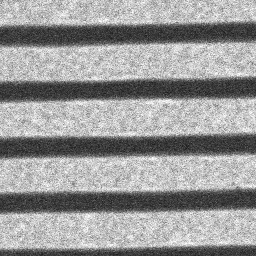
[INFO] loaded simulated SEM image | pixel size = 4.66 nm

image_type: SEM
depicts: parallel lines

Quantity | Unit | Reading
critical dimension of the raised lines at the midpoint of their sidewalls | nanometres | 171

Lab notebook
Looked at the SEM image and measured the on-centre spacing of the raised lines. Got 0.26 micrometres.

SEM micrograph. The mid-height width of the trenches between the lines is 19.2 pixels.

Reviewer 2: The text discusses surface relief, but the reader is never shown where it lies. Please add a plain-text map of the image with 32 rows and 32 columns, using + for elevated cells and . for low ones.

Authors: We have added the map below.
++++++++++++++++++++++++++++++++
++++++++++++++++++++++++++++++++
++++++++++++++++++++++++++++++++
................................
................................
................++++++++++++++++
++++++++++++++++++++++++++++++++
++++++++++++++++++++++++++++++++
++++++++++++++++++++++++++++++++
++++++++++++++++++++++++++++++++
................................
................................
.........+++++++++++++++++++++++
++++++++++++++++++++++++++++++++
++++++++++++++++++++++++++++++++
++++++++++++++++++++++++++++++++
++++++++++++++++++++++++++++++++
................................
................................
...............+++++++++++++++++
++++++++++++++++++++++++++++++++
++++++++++++++++++++++++++++++++
++++++++++++++++++++++++++++++++
++++++++++++++++++++++++++++++++
................................
................................
.....................+++++++++++
++++++++++++++++++++++++++++++++
++++++++++++++++++++++++++++++++
++++++++++++++++++++++++++++++++
++++++++++++++++++++++++++++++++
................................